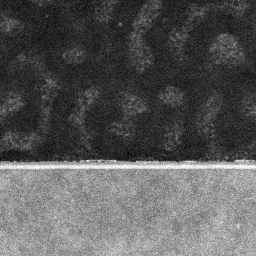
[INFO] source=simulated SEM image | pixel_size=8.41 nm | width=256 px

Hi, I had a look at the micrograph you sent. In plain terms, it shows one or a few lines or trenches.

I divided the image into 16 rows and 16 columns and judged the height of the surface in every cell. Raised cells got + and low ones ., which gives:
................
................
................
................
................
................
................
................
................
................
++++++++++++++++
++++++++++++++++
++++++++++++++++
++++++++++++++++
++++++++++++++++
++++++++++++++++